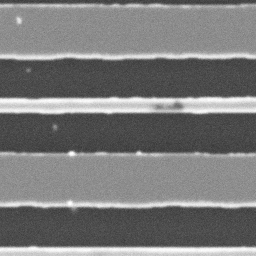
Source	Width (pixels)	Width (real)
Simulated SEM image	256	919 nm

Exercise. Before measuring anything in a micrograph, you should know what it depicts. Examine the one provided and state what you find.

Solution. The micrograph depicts lines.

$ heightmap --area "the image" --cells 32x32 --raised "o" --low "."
................................
oooooooooooooooooooooooooooooooo
oooooooooooooooooooooooooooooooo
oooooooooooooooooooooooooooooooo
oooooooooooooooooooooooooooooooo
oooooooooooooooooooooooooooooooo
oooooooooooooooooooooooooooooooo
................................
................................
................................
................................
................................
oooo.ooooooooooooooooooooooooooo
oooooooooooooooooooooooooooooooo
................................
................................
................................
................................
................................
oooooooooooooooooooooooooooooooo
oooooooooooooooooooooooooooooooo
oooooooooooooooooooooooooooooooo
oooooooooooooooooooooooooooooooo
oooooooooooooooooooooooooooooooo
oooooooooooooooooooooooooooooooo
oooooooooooooooooooooooooooooooo
................................
................................
................................
................................
................................
oooooooooooooooooooooooooooooooo